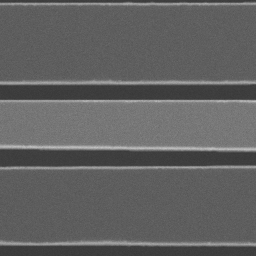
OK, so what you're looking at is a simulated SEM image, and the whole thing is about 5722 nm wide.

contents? lines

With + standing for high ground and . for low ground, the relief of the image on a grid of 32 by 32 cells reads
++++++++++++++++++++++++++++++++
++++++++++++++++++++++++++++++++
++++++++++++++++++++++++++++++++
++++++++++++++++++++++++++++++++
++++++++++++++++++++++++++++++++
++++++++++++++++++++++++++++++++
++++++++++++++++++++++++++++++++
++++++++++++++++++++++++++++++++
++++++++++++++++++++++++++++++++
++++++++++++++++++++++++++++++++
+++++++++++...+++...............
................................
................................
++++++++++++++++++++++++++++++++
++++++++++++++++++++++++++++++++
++++++++++++++++++++++++++++++++
++++++++++++++++++++++++++++++++
++++++++++++++++++++++++++++++++
...+++++++++++++++++++++++++++++
................................
................................
++++++++++++++++++++++++++++++++
++++++++++++++++++++++++++++++++
++++++++++++++++++++++++++++++++
++++++++++++++++++++++++++++++++
++++++++++++++++++++++++++++++++
++++++++++++++++++++++++++++++++
++++++++++++++++++++++++++++++++
++++++++++++++++++++++++++++++++
++++++++++++++++++++++++++++++++
++++++++++++++++++++++++++++++++
................................